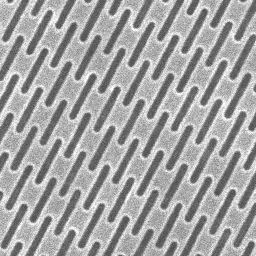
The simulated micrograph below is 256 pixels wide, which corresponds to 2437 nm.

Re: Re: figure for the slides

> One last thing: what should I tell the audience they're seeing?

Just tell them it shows a regular array of holes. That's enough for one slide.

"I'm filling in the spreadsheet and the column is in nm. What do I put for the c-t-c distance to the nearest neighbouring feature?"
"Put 258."